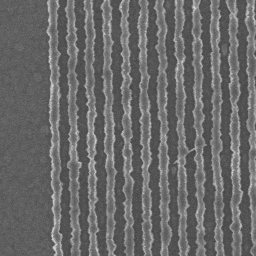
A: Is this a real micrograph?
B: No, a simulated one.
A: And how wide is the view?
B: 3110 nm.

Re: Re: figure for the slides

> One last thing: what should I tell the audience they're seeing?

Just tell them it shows parallel lines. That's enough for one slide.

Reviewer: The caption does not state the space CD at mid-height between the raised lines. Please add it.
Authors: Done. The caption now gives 124 nm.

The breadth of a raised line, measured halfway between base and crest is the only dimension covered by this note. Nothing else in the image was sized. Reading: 92.6 nm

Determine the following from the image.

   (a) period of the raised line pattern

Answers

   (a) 0.218 microns